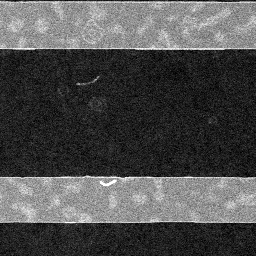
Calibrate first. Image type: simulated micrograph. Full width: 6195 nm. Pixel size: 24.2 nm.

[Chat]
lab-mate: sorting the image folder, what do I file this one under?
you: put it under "one or a few lines or trenches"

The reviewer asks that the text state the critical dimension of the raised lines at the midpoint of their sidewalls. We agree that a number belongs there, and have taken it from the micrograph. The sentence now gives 1110 nanometers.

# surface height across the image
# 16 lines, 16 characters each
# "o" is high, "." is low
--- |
oooooooooooooooo
oooooooooooooooo
oooooooooooooooo
................
................
................
................
................
................
................
................
oooooooooooooooo
oooooooooooooooo
oooooooooooooooo
................
................